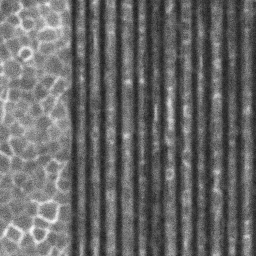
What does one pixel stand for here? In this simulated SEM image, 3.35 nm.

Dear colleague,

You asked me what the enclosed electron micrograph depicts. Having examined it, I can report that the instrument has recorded parallel lines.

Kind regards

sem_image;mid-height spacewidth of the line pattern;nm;23.9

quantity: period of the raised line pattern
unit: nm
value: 50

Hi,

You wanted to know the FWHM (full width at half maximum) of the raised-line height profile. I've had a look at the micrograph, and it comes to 0.0285 micrometres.